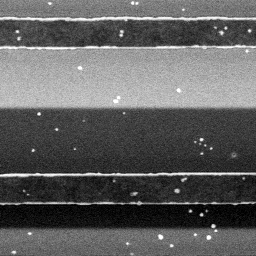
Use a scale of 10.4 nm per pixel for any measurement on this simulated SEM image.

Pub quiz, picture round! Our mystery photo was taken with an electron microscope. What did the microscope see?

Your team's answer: lines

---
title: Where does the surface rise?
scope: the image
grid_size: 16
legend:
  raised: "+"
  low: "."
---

................
++++++++++++++++
++++++++++++++++
................
................
................
................
................
................
................
................
++++++++++++++++
++++++++++++++++
................
................
................